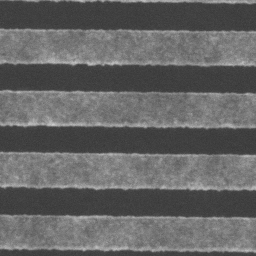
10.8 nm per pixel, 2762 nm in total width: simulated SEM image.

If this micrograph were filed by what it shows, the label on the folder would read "lines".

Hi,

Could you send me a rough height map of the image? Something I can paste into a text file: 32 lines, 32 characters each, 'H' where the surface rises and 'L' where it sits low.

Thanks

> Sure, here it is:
LLLLLLLLLLLLLLLLLLLLLLLLLLLLLLLL
LLLLLLLLLLLLLLLLLLLLLLLLLLLLLLLL
LLLLLLLLLLLLLLLLLLLLLLLLLLLLLLLL
LLLLLLLLLLLLLLLLLLLLLLLLLLLLLLLL
HHHHHHHHHHHHHHHHHHHHHHHHHHHHHHHH
HHHHHHHHHHHHHHHHHHHHHHHHHHHHHHHH
HHHHHHHHHHHHHHHHHHHHHHHHHHHHHHHH
HHHHHHHHHHHHHHHHHHHHHHHHHHHHHHHH
LLLLLLLLLLLLLLLLLLLLLLLLLLLLLLLL
LLLLLLLLLLLLLLLLLLLLLLLLLLLLLLLL
LLLLLLLLLLLLLLLLLLLLLLLLLLLLLLLL
HHHHHHHHLHHLLLLLLLLLLLLLLLLLLLLL
HHHHHHHHHHHHHHHHHHHHHHHHHHHHHHHH
HHHHHHHHHHHHHHHHHHHHHHHHHHHHHHHH
HHHHHHHHHHHHHHHHHHHHHHHHHHHHHHHH
HHHHHHHHHHHHHHHHHHHHHHHHHHHHHHHH
LLLLLLLLLLLLLLLLLLLLLLLLLLLLLLLL
LLLLLLLLLLLLLLLLLLLLLLLLLLLLLLLL
LLLLLLLLLLLLLLLLLLLLLLLLLLLLLLLL
HHHHHHHHHHHHHHHHHHHHHHHHHHHHHHHH
HHHHHHHHHHHHHHHHHHHHHHHHHHHHHHHH
HHHHHHHHHHHHHHHHHHHHHHHHHHHHHHHH
HHHHHHHHHHHHHHHHHHHHHHHHHHHHHHHH
LLLLLLLLLLLLHLLHLLLLLLLHHHHHHHHH
LLLLLLLLLLLLLLLLLLLLLLLLLLLLLLLL
LLLLLLLLLLLLLLLLLLLLLLLLLLLLLLLL
LLLLLLLLLLLLLLLLLLLLLLLLLLLLLLLL
HHHHHHHHHHHHHHHHHHHHHHHHHHHHHHHH
HHHHHHHHHHHHHHHHHHHHHHHHHHHHHHHH
HHHHHHHHHHHHHHHHHHHHHHHHHHHHHHHH
HHHHHHHHHHHHHHHHHHHHHHHHHHHHHHHH
LLLLLLLLLLLLLLLLLLLLLLLLLLLLLLLL